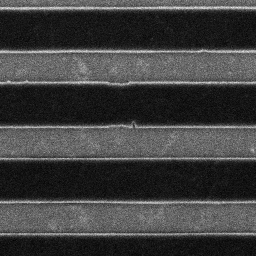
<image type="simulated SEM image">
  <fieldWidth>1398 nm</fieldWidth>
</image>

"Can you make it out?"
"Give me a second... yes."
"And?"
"one or a few lines or trenches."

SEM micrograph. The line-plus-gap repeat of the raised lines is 411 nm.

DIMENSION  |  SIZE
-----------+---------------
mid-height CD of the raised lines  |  244 nanometers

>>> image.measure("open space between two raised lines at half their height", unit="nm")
168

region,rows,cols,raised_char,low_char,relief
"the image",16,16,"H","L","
LLLLLLLLLLLLLHHH
HHHHHHHHHHHHHHHH
HHHHHHHHHHHHHHHH
LLLLLLLLLLLLLLLL
LLLLLLLLLLLLLLLL
HHHHHHHHHHHHHHHH
HHHHHHHHHHHHHHHH
HHHHHHHHHHHHHHHH
LLLLLLLLLLLLLLLL
LLLLLLLLLLLLLLLL
HHHHHHHHHHHHHHHH
HHHHHHHHHHHHHHHH
HHHHHHHHHHHHHHHH
LLLLLLLLLLLLLLLL
LLLLLLLLLLLLLLLL
HHHHHHHHHHHHHHHH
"